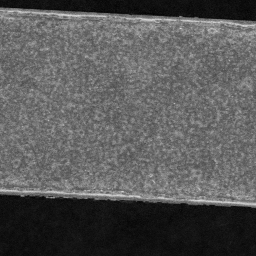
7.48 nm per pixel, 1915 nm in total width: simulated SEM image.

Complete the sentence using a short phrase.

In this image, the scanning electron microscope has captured one or a few lines or trenches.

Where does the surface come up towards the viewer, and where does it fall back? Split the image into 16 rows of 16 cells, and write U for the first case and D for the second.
DDDDDDDDDDDDDDDD
UUUUUUUUUUUUUUUD
UUUUUUUUUUUUUUUU
UUUUUUUUUUUUUUUU
UUUUUUUUUUUUUUUU
UUUUUUUUUUUUUUUU
UUUUUUUUUUUUUUUU
UUUUUUUUUUUUUUUU
UUUUUUUUUUUUUUUU
UUUUUUUUUUUUUUUU
UUUUUUUUUUUUUUUU
UUUUUUUUUUUUUUUU
DDDDDDDDDDDUUUUU
DDDDDDDDDDDDDDDD
DDDDDDDDDDDDDDDD
DDDDDDDDDDDDDDDD